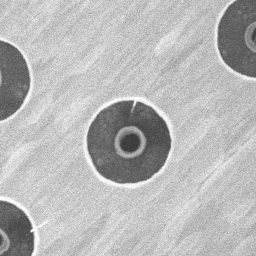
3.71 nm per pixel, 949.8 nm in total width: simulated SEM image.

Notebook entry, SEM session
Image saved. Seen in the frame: ring-shaped grooves with a dot in the middle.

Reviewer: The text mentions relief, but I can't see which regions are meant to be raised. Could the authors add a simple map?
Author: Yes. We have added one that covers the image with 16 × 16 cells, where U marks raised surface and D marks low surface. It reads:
UUUUUUUUUUUUUUDD
UUUUUUUUUUUUUUDD
UUUUUUUUUUUUUUDD
DUUUUUUUUUUUUUDD
DDUUUUUUUUUUUUUD
DDUUUUUUUUUUUUUU
DUUUUUUDDUUUUUUU
UUUUUUDDDDUUUUUU
UUUUUDDDDDDUUUUU
UUUUUDDDDDDUUUUU
UUUUUUDDDDUUUUUU
UUUUUUUDUUUUUUUU
UUUUUUUUUUUUUUUU
DDUUUUUUUUUUUUUU
DDUUUUUUUUUUUUUU
DDUUUUUUUUUUUUUU